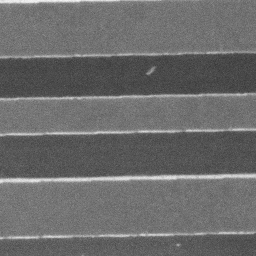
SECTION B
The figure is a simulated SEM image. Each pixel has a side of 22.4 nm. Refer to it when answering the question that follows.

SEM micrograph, lines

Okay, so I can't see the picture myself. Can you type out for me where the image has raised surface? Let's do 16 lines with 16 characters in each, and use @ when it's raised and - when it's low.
@@@@@@@@@@@@@@@@
@@@@@@@@@@@@@@@@
@@@@@@@@@@@@@@@@
@@@-------------
----------------
----------------
@@@@@@@@@@@@@@@@
@@@@@@@@@@@@@@@@
----------------
----------------
----------------
@@@@@@@@@@@@@@@@
@@@@@@@@@@@@@@@@
@@@@@@@@@@@@@@@@
@@@@@@@@@@@@@@@@
----------------